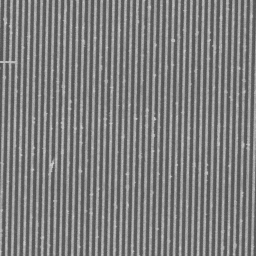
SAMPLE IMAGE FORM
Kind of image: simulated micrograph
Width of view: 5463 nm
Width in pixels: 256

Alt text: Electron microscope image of parallel lines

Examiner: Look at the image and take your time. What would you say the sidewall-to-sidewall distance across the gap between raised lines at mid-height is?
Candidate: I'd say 80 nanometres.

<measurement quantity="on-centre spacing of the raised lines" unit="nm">128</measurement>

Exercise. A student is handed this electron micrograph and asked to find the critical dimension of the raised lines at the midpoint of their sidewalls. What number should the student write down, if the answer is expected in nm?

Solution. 40